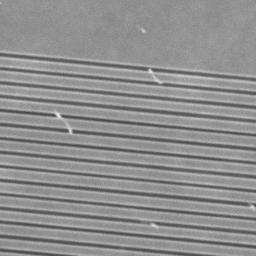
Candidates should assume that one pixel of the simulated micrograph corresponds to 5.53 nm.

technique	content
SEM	parallel lines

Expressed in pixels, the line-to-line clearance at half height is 4.47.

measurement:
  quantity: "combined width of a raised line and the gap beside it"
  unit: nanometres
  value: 76.8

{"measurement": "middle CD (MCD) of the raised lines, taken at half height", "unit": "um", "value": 0.0543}